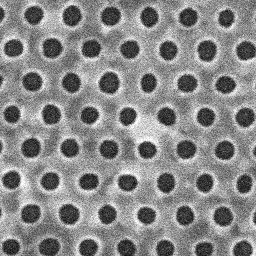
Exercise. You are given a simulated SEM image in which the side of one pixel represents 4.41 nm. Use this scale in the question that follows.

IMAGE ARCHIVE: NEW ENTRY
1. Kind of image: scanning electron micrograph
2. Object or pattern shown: a regular array of holes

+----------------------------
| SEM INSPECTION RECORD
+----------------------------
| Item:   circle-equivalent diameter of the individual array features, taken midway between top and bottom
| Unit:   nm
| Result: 89.6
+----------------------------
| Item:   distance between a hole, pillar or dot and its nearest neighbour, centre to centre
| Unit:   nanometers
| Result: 167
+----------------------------